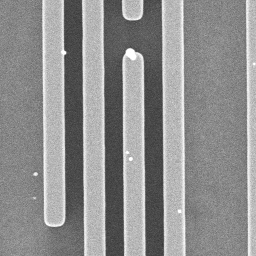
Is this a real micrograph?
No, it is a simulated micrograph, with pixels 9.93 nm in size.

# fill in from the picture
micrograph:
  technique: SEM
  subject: groups of lines, slits or small figures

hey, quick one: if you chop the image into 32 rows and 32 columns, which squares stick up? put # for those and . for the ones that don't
.....###..###..###..###........#
.....###..###..###..###........#
.....###..###.......###........#
.....###..###.......###........#
.....###..###.......###........#
.....###..###.......###........#
.....###..###...#...###........#
.....###..###..###..###........#
.....###..###..###..###........#
.....###..###..###..###........#
.....###..###..###..###........#
.....###..###..###..###........#
......##..###..###..###........#
......##..###..###..###........#
......##..###..###..###........#
......##..###..###..###........#
......##..###..###..###........#
......##..###..###..###........#
......##..###..###..###........#
......##..###..###..###........#
......##..###...##..###........#
......##..###...##..###........#
......##..###...##..###........#
......##..###...##..###........#
......##...##...##..###........#
......##...##...##..###........#
......##...##...##..###........#
......##...##...##..###........#
...........##...##..###........#
...........##...##...##........#
...........##...##...##........#
...........##...##...##........#